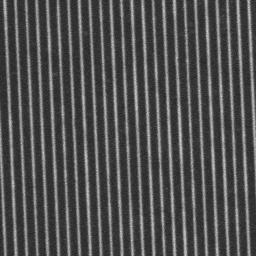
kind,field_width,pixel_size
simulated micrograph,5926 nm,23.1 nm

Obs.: parallel lines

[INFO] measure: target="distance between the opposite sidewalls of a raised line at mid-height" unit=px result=2.25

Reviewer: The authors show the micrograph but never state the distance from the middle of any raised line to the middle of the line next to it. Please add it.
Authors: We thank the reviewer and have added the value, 245 nm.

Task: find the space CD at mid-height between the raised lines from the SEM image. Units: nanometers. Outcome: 197